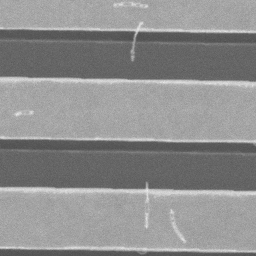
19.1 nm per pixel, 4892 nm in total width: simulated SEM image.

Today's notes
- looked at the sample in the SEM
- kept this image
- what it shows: lines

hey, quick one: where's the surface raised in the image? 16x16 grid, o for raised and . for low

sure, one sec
oooooooooooooooo
oooooooooooooooo
................
................
................
oooooooooooooooo
oooooooooooooooo
oooooooooooooooo
oooooooooooooooo
................
................
................
oooooooooooooooo
oooooooooooooooo
oooooooooooooooo
oooooooooooooooo